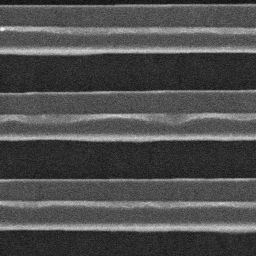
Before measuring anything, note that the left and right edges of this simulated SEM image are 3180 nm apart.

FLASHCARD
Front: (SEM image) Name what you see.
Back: lines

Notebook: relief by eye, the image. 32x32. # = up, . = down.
................................
################################
################################
################################
################################
################################
................................
................................
................................
................................
................................
.............###################
################################
################################
################################
################################
################################
................................
................................
................................
................................
................................
.###############################
################################
################################
################################
################################
################################
................................
................................
................................
................................